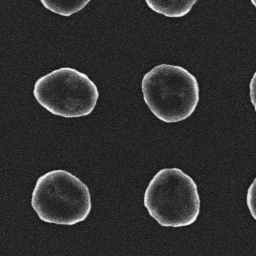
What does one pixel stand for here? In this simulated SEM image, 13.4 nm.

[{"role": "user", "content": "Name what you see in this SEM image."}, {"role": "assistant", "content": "raised bodies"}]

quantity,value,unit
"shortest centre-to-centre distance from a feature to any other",1.4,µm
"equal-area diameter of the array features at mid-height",746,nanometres